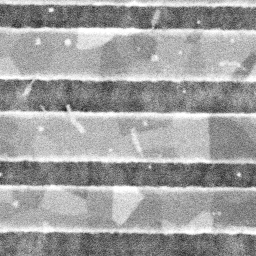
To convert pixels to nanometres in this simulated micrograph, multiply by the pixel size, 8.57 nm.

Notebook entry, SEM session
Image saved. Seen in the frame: lines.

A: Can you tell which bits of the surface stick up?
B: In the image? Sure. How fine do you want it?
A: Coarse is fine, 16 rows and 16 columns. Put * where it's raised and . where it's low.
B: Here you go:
................
................
****************
****************
****************
................
................
****************
****************
****************
................
................
****************
****************
..........******
................